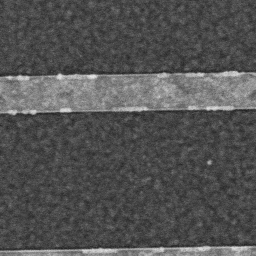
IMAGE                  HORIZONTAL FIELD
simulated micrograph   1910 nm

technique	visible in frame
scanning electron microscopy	one or a few lines or trenches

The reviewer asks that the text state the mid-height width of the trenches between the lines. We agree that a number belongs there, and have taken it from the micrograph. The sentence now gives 1030 nanometers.